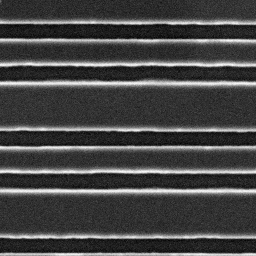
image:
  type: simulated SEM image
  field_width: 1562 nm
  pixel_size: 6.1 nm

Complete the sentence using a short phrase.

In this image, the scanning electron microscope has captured lines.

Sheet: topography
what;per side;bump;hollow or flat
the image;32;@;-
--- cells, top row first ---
@@@@@@@@@@@@@@@@@@@@@@@@@@@@@@@@
@@@@@@@@@@@@@@@@@@@@@@@@@@@@@@@@
@@@@@@@@@@@@@@@@@@@@@@@@@@@@@@@@
--------------------------------
--------------------------------
@@@@@@@@@@@@@@@@@@@@@@@@@@@@@@@@
@@@@@@@@@@@@@@@@@@@@@@@@@@@@@@@@
@@@@@@@@@@@@@@@@@@@@@@@@@@@@@@@@
--------------------------------
--------------------------------
@@@@@@@@@@@@@@@@@@@@@@@@@@@@@@@@
@@@@@@@@@@@@@@@@@@@@@@@@@@@@@@@@
@@@@@@@@@@@@@@@@@@@@@@@@@@@@@@@@
@@@@@@@@@@@@@@@@@@@@@@@@@@@@@@@@
@@@@@@@@@@@@@@@@@@@@@@@@@@@@@@@@
@@@@@@@@@@@@@@@@@@@@@@@@@@@@@@@@
--------------------------------
--------------------------------
@@@@@@@@@@@@@@@@@@@@@@@@@@@@@@@@
@@@@@@@@@@@@@@@@@@@@@@@@@@@@@@@@
@@@@@@@@@@@@@@@@@@@@@@@@@@@@@@@@
-@@@@@@@@@@@---@@@@@@@@@@@@@@@@@
--------------------------------
--------------------------------
@@@@@@@@@@@@@@@@@@@@@@@@@@@@@@@@
@@@@@@@@@@@@@@@@@@@@@@@@@@@@@@@@
@@@@@@@@@@@@@@@@@@@@@@@@@@@@@@@@
@@@@@@@@@@@@@@@@@@@@@@@@@@@@@@@@
@@@@@@@@@@@@@@@@@@@@@@@@@@@@@@@@
@@@@@@@@@@@@@@@@@@@@@@@@@@@@@@@@
--------------------------------
--------------------------------